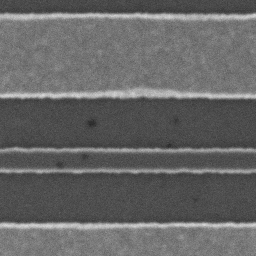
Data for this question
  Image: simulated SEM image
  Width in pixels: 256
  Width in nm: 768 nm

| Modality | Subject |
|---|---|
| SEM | lines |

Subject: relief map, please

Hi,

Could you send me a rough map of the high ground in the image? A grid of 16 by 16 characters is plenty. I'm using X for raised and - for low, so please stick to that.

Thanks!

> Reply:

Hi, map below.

----------------
XXXXXXXXXXXXXXXX
XXXXXXXXXXXXXXXX
XXXXXXXXXXXXXXXX
XXXXXXXXXXXXXXXX
XXXXXXXXXXXXXXXX
----------------
----------------
----------------
XXXXXXXXXXXXXXXX
XXXXXXXXXXXXXXXX
----------------
----------------
----------------
XXXXXXXXXXXXXXXX
XXXXXXXXXXXXXXXX